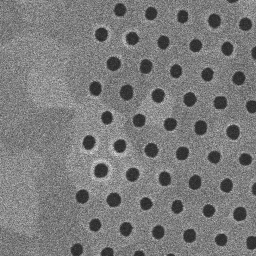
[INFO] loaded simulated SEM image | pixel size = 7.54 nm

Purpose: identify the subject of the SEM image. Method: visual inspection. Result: a regular array of holes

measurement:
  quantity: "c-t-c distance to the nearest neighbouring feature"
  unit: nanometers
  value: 231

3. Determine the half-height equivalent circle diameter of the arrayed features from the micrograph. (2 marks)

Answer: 102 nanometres